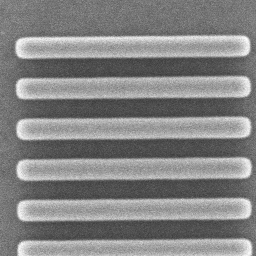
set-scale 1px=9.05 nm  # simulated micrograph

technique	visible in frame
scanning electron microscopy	groups of lines, slits or small figures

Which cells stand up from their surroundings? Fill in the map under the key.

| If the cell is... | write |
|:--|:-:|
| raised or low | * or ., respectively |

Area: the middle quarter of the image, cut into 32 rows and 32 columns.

................................
................................
................................
......................**********
********************************
********************************
********************************
********************************
................................
................................
................................
................................
................................
................................
********************************
********************************
********************************
********************************
*************************..****.
................................
................................
................................
................................
................................
********************************
********************************
********************************
********************************
********************************
................................
................................
................................